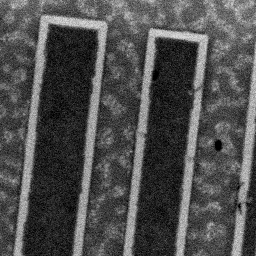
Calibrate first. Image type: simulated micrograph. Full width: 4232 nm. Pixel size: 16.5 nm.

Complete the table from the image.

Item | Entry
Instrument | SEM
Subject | one or a few lines or trenches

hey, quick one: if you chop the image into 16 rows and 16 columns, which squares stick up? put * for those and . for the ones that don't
................
...**...........
...***....**....
...***...****...
..****...***....
..****...***....
..****...***....
..****...***....
..****...***....
..****...***...*
..***....***...*
..***...****...*
..***...****...*
.****...***....*
.****...***....*
.****...***....*